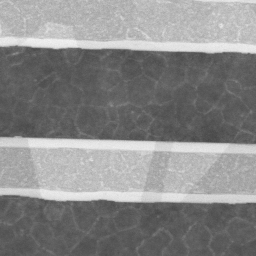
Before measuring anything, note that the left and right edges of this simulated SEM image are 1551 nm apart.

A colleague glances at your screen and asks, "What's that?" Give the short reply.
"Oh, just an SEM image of one or a few lines or trenches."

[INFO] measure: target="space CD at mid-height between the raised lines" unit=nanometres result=614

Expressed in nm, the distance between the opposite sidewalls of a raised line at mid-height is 301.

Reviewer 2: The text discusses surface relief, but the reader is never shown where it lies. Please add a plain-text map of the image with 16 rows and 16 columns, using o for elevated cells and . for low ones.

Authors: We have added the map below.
oooooooooooooooo
oooooooooooooooo
oooooooooooooooo
................
................
................
................
................
................
oooooooooooooooo
oooooooooooooooo
oooooooooooooooo
................
................
................
................